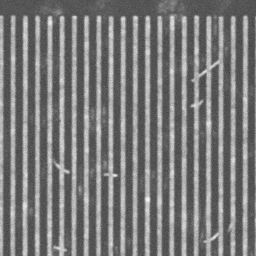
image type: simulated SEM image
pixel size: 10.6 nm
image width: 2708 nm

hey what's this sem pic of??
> parallel lines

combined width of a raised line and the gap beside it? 130 nm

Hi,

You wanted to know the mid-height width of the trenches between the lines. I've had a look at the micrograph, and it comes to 0.0926 micrometres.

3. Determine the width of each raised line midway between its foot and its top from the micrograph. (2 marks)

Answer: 31.7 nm